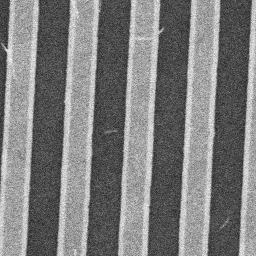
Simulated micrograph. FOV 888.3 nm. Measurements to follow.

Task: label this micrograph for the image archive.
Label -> parallel lines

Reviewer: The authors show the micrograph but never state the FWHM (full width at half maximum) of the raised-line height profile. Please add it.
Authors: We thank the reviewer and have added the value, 81.5 nanometers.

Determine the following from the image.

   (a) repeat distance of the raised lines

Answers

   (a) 60.5 px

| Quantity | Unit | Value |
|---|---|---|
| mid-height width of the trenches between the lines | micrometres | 0.127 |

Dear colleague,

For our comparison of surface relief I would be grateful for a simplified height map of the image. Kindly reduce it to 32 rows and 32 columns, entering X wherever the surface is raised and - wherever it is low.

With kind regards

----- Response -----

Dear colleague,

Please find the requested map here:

--XX-----XXX-----XXX----XXX-----
--XX-----XXX-----XX-----XXX-----
-XXX-----XXX-----XXX----XXX-----
-XXX-----XXX-----XXX----XXX-----
-XXX-----XXX----XXX-----XXX-----
-XXX-----XXX----XXX-----XXX-----
-XXX-----XXX----XXX-----XXX----X
-XXX-----XXX----XXX-----XXX----X
-XXX-----XXX----XXX-----XXX----X
-XXX-----XXX----XXX-----XXX----X
-XXX-----XXX----XXX-----XXX----X
-XXX-----XX-----XXX-----XXX----X
-XXX----XXX-----XXX-----XXX----X
-XXX-----XX-----XXX-----XX-----X
-XXX----XXX-----XXX-----XX-----X
-XXX----XXX-----XXX-----XX-----X
-XXX----XXX-----XXX----XXXX----X
-XXX----XXX-----XXX----XXX-----X
-XXX----XXX-----XXX----XXX-----X
-XX-----XXX-----XXX----XXX-----X
-XXX----XXX-----XXX----XXX-----X
-XX-----XXX-----XXX----XXX-----X
XXX-----XXX-----XXX----XXX-----X
XXX-----XXX-----XX-----XXX-----X
XXX-----XXX----XXX-----XXX-----X
XXX-----XXX----XXX-----XXX-----X
XXX-----XXX----XXX-----XXX----XX
XXX-----XXX----XXX-----XXX----XX
XXX-----XXX----XXX-----XXX----XX
XXX-----XXX----XXX-----XXX----XX
XXX-----XXX----XXX-----XXX----XX
XXX-----XX-----XXX-----XXX----XX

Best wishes